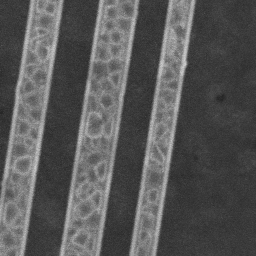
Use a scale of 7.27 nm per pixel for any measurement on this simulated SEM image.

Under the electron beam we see one or a few lines or trenches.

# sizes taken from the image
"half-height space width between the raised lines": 270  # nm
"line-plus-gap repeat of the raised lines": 0.48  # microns